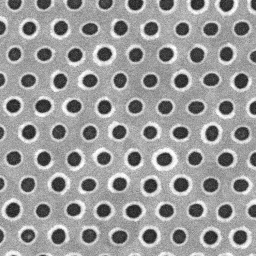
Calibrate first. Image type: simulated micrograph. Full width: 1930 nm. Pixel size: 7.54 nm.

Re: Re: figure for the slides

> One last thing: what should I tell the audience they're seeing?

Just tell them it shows a regular array of holes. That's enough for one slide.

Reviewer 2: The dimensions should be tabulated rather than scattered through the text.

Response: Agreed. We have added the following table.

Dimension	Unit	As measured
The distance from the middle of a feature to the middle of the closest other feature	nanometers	222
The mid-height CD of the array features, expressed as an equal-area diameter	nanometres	118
